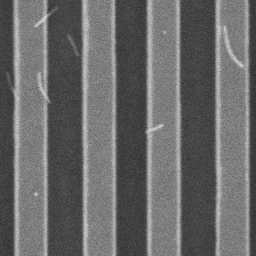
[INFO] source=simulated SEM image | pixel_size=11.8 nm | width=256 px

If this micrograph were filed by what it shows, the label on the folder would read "lines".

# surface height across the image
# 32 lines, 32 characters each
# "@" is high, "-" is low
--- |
--@@@@----@@@@----@@@@-----@@@@-
--@@@@----@@@@----@@@@-----@@@@-
--@@@@----@@@@----@@@@-----@@@@-
--@@@@----@@@@----@@@@-----@@@@-
--@@@@----@@@@----@@@@-----@@@@-
--@@@@----@@@@----@@@@-----@@@@-
--@@@@----@@@@----@@@@-----@@@@-
--@@@@----@@@@----@@@@-----@@@@-
--@@@@----@@@@----@@@@-----@@@@-
--@@@@----@@@@----@@@@-----@@@@-
--@@@@----@@@@----@@@@-----@@@@-
--@@@@----@@@@----@@@@-----@@@@-
--@@@@----@@@@----@@@@-----@@@@-
--@@@@----@@@@----@@@@-----@@@@-
--@@@@----@@@@----@@@@-----@@@@-
--@@@@----@@@@----@@@@-----@@@@-
--@@@@----@@@@----@@@@-----@@@@-
--@@@@----@@@@----@@@@-----@@@@-
--@@@@----@@@@----@@@@-----@@@@-
--@@@@----@@@@----@@@@-----@@@@-
--@@@@----@@@@----@@@@-----@@@@-
--@@@@----@@@@----@@@@-----@@@@-
--@@@@----@@@@----@@@@-----@@@@-
--@@@@----@@@@----@@@@-----@@@@-
--@@@@----@@@@-----@@@-----@@@@-
--@@@@----@@@@-----@@@-----@@@@-
--@@@@----@@@@-----@@@-----@@@@-
--@@@@----@@@@----@@@@-----@@@@-
--@@@@----@@@@-----@@@-----@@@@-
--@@@@----@@@@-----@@@-----@@@@-
--@@@@----@@@@-----@@@-----@@@@-
--@@@@----@@@@-----@@@-----@@@@-